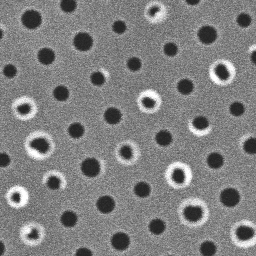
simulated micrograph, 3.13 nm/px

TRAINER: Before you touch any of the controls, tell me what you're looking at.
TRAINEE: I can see a regular array of holes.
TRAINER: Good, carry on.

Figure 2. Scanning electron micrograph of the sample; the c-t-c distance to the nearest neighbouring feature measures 122 nm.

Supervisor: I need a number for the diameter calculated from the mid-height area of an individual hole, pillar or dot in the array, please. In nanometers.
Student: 51.2